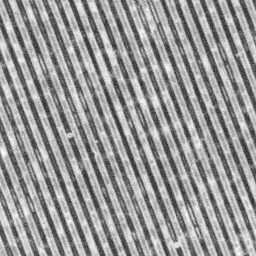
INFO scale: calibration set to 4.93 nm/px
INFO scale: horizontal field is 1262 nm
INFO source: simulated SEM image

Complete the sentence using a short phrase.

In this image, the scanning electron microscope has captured parallel lines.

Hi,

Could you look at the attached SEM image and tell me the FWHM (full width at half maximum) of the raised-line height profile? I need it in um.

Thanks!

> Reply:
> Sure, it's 0.0282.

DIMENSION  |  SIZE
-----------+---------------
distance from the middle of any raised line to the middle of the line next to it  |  60.4 nanometers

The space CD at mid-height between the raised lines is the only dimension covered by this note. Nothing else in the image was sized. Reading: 32.8 nm